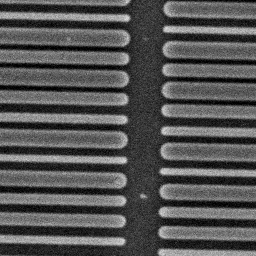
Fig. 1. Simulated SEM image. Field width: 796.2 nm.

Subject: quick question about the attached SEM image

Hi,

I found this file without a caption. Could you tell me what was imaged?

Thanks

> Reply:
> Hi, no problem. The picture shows groups of lines, slits or small figures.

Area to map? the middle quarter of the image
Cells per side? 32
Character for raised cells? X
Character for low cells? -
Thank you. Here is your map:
-------------------------XXXXXXX
XXXX---------------------XXXXXXX
XXXXXXXXXXXXXXXX---------XXXXXXX
XXXXXXXXXXXXXXXX----------------
XXXXXXXXXXXXXXXX----------------
-XXXXXXXXXXXXXX----------XXXXXXX
-------------------------XXXXXXX
XXXXXXXXXXXXXXX----------XXXXXXX
XXXXXXXXXXXXXXXX-----------XXXXX
XXXXXXXXXXXXXXXX----------------
-------------------------XXXXXXX
-------------------------XXXXXXX
-------------------------XXXXXXX
XXXXXXXXXXXXXXXX----------------
XXXXXXXXXXXXXXXX----------------
--------------------------------
------------------------XXXXXXXX
XXXXXXXXXXXXXXX----------XXXXXXX
XXXXXXXXXXXXXXXX----------------
XXXXXXXXXXXXXXXX----------------
XXXXXXXXXXXXXXX----------XXXXXXX
------------------------XXXXXXXX
------------------------XXXXXXXX
XXXXXXXXXXXXX------------XXXXXXX
------XXXXXXXXX-----------------
--------------------------------
------------------------XXXXXXXX
XXXXXXXXXXXXXX----------XXXXXXXX
XXXXXXXXXXXXXXX-----------------
XXXXXXXXXXXXXXXX----------------
XXXXXXXXXXXXXXX----------XXXXXXX
------------------------XXXXXXXX